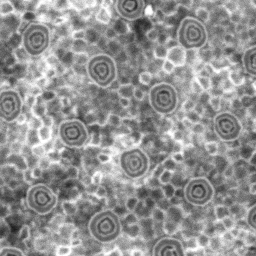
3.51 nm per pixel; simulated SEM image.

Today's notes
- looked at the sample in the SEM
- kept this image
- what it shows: a regular array of ring-shaped raised bodies with a dot in the middle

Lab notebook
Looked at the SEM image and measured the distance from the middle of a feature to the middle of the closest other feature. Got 244 nm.